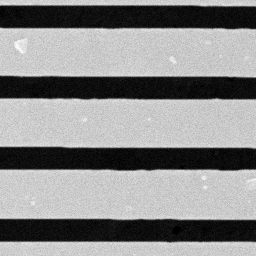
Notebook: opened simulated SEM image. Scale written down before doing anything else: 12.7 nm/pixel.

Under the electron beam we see lines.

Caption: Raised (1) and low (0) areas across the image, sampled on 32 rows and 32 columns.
11111111111111111111111111111111
00000000000000000000000000000000
00000000000000000000000000000000
10000000000000000000000000000000
11111111111111111111111111111111
11111111111111111111111111111111
11111111111111111111111111111111
11111111111111111111111111111111
11111111111111111111111111111111
00000000000000000000000000001111
00000000000000000000000000000000
00000000000000000000000000000000
11111111110111111100000000110000
11111111111111111111111111111111
11111111111111111111111111111111
11111111111111111111111111111111
11111111111111111111111111111111
11111111111111111111111111111111
00000000000000000000000000000001
00000000000000000000000000000000
00000000000000000000000000000000
11111111111111111111111111111111
11111111111111111111111111111111
11111111111111111111111111111111
11111111111111111111111111111111
11111111111111111111111111111111
11111111111111111111111111111111
00000000000000000000000000000000
00000000000000000000000000000000
00000000000000000000000000000000
11111111111111111111111111111111
11111111111111111111111111111111